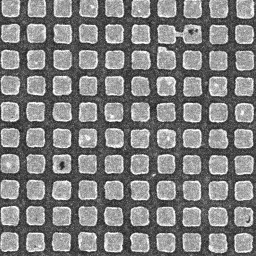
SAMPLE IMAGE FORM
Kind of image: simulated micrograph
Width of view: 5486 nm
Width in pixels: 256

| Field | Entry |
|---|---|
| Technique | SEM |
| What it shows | a regular array of raised bodies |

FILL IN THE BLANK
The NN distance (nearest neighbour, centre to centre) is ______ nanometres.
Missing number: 549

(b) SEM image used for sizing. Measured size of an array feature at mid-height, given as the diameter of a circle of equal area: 423 nanometres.